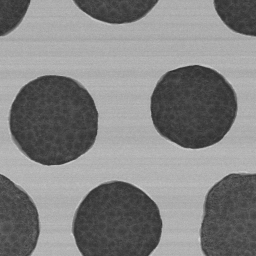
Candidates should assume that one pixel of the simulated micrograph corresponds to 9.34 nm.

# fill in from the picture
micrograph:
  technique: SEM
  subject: holes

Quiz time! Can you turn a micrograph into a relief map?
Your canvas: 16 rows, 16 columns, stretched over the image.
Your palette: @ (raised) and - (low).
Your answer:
--@@@-----@@@---
-@@@@@@@@@@@@@--
@@@@@@@@@@@@@@@@
@@@@@@@@@@@@@@@@
@@@@@@@@@@@---@@
@----@@@@@-----@
@-----@@@------@
@-----@@@@-----@
@-----@@@@----@@
@----@@@@@@@@@@@
@@@@@@@@@@@@@@@@
-@@@@@@-@@@@@---
--@@@----@@@@---
--@@@-----@@@---
--@@@-----@@----
--@@@-----@@@---